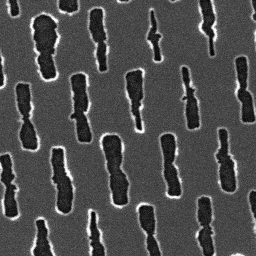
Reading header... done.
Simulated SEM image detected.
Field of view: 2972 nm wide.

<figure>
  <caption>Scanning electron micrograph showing a regular array of holes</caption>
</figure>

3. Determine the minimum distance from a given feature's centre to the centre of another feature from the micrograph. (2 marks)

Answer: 0.642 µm